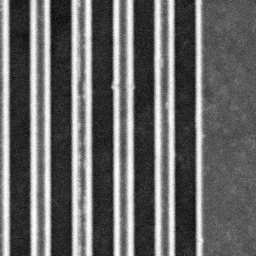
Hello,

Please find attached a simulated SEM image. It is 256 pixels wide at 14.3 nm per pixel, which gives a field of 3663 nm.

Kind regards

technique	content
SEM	parallel lines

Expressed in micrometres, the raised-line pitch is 0.592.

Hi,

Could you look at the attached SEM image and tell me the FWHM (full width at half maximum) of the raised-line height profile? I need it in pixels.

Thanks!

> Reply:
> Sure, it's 15.1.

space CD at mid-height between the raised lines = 26.5 px